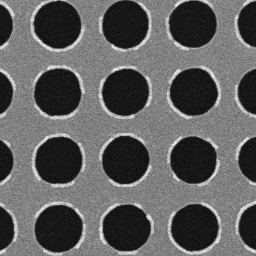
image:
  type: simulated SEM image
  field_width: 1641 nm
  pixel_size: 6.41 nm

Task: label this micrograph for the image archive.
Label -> a regular array of holes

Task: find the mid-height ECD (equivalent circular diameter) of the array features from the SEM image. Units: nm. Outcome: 304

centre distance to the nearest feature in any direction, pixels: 67.6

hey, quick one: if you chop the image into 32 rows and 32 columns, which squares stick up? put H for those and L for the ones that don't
HHHHHHLLLHHHHHLLLHHHHHHLLLHHHHHL
LHHHHLLLLLHHHLLLLLHHHHLLLLLHHHLL
LLHHLLLLLLHHHLLLLLLHHLLLLLLHHHLL
LLHHLLLLLLHHHLLLLLLHHLLLLLLHHHLL
LHHHHLLLLLHHHLLLLLHHHLLLLLLHHHLL
HHHHHHLLLHHHHHLLLHHHHHHLLLHHHHHL
HHHHHHHHHHHHHHHHHHHHHHHHHHHHHHHH
HHHHHHHHHHHHHHHHHHHHHHHHHHHHHHHH
HHHHHHHHHHHHHHHHHHHHHHHHLHHHHHHH
LHHHHLLLLHHHHHLLLLHHHHLLLLHHHHLL
LHHHHLLLLLHHHLLLLLHHHLLLLLLHHHLL
LLHHLLLLLLHHHLLLLLLHHLLLLLLHHHLL
LHHHLLLLLLHHHLLLLLHHHLLLLLLHHHLL
LHHHHLLLLHHHHLLLLLHHHHLLLLHHHHHL
HHHHHHLLHHHHHHHHHHHHHHHHHHHHHHHH
HHHHHHHHHHHHHHHHHHHHHHHHHHHHHHHH
HHHHHHHHHHHHHHHHHHHHHHHHHHHHHHHH
HHHHHHLLLHHHHHLLLHHHHHHLLLHHHHHL
LHHHHLLLLLHHHLLLLLHHHHLLLLLHHHLL
LLHHLLLLLLHHHLLLLLLHHLLLLLLHHHLL
LLHHLLLLLLHHHLLLLLLHHLLLLLLHHHLL
LHHHHLLLLLHHHLLLLLHHHHLLLLLHHHLL
HHHHHLLLLHHHHHLLLHHHHHHLLLHHHHHL
HHHHHHHHHHHHHHHHHHHHHHHHHHHHHHHH
HHHHHHHHHHHHHHHHHHHHHHHHHHHHHHHH
HHHHHHHHHHHHHHHHHHHHHHHHLHHHHHHH
LHHHHLLLLHHHHHLLLLHHHHLLLLLHHHLL
LLHHHLLLLLHHHLLLLLLHHHLLLLLHHHLL
LLHHLLLLLLHHHLLLLLLHHLLLLLLHHHLL
LLHHLLLLLLHHHLLLLLLHHHLLLLLHHHLL
LHHHHLLLLLHHHHLLLLHHHHLLLLHHHHHL
HHHHHHLLHHHHHHHHHHHHHHHHHHHHHHHH